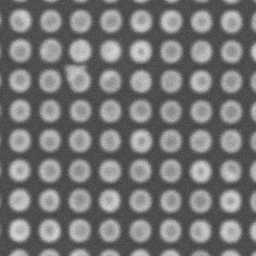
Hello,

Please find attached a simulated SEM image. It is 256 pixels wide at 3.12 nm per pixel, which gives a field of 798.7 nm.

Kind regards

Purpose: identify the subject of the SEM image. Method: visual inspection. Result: a regular array of raised bodies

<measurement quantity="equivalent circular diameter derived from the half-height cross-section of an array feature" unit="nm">59.9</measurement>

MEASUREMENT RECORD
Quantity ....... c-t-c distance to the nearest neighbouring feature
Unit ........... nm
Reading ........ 92.7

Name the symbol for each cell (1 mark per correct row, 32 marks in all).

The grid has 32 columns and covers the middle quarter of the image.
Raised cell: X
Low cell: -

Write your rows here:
--------------------------------
--------------------------------
---XX-----XXX-----XXX----XXX----
--XXXX---XXXXX---XXXX----XXXX---
--XXXX---XXXXX---XXXX----XXXX---
--XXXX----XXXX---XXXX----XXXX---
---XX-----XXX-----XX------XX----
--------------------------------
--------------------------------
-----------X-------X------------
--XXXX----XXX----XXXX----XXXX---
--XXXX----XXXX---XXXX----XXXX---
--XXXX----XXXX---XXXX----XXXX---
--XXXX----XXX----XXXX----XXX----
--------------------------------
--------------------------------
--------------------------------
--XXXX----XXX-----XXX----XXX----
--XXXX---XXXXX---XXXXX---XXXX---
--XXXX---XXXXX---XXXXX--XXXXX---
--XXXX----XXX----XXXX---XXXXX---
---XX------X------XX------XX----
--------------------------------
--------------------------------
---XX-------------XX------XX----
--XXXX----XXX----XXXX----XXXX---
--XXXX---XXXXX---XXXX---XXXXX---
--XXXX---XXXXX---XXXX---XXXXX---
--XXX-----XXX-----XXX----XXX----
--------------------------------
--------------------------------
--------------------------------